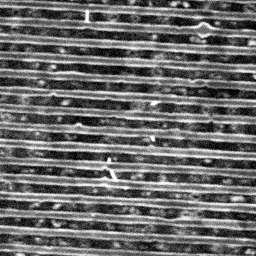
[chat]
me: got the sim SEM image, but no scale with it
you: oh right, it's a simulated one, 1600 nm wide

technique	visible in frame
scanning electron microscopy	parallel lines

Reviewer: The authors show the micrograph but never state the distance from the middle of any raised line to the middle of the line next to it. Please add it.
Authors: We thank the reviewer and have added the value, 109 nanometres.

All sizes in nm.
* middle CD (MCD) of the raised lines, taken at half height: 44.4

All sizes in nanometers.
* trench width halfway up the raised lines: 67